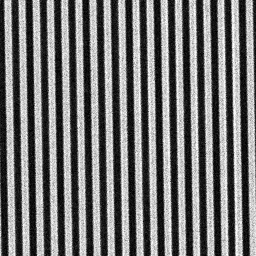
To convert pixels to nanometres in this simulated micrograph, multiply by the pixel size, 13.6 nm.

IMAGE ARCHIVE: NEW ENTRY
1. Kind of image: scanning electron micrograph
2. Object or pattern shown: parallel lines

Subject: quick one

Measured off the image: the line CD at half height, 0.106 microns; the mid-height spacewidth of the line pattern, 93.8 nm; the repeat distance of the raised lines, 0.194 um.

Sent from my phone